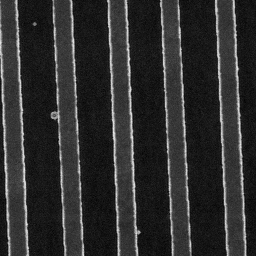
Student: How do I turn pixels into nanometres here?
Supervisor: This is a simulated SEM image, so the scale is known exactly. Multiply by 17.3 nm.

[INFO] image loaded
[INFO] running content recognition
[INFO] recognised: lines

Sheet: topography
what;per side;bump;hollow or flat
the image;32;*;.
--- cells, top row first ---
**.....**....***....**.....**...
**.....**.....**....**.....**...
**.....**.....**....**.....**...
**.....**.....**....***....**...
**.....**.....**....***....***..
**.....**.....**....***....***..
**.....**.....**....***....***..
**.....**.....**....***....***..
**.....**.....**....***....***..
**.....**.....**.....**....***..
***....**.....**.....**....***..
***....**.....**.....**....***..
***....***....**.....**.....**..
***....***....**.....**.....**..
***....***....**.....**.....**..
***....***....**.....**.....**..
.**....***....**.....**.....**..
.**....***....***....**.....**..
.**.....**....***....**.....**..
.**.....**....***....**.....**..
.**.....**....***....**.....**..
.**.....**....***....**.....**..
.**.....**....***....**.....**..
.**.....**.....**....**.....**..
.**.....**.....**....**.....**..
.**.....**.....**....***....**..
.**.....**.....**....***....**..
.**.....**.....**....***....***.
.**.....**.....**....***....***.
.**.....**.....**....***....***.
.**.....**.....**.....**....***.
.**.....**.....**.....**....***.